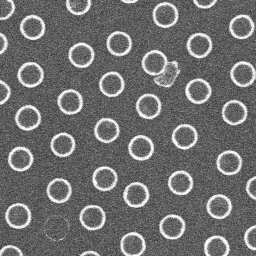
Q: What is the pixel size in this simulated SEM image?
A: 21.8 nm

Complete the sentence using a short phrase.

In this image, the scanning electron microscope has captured a regular array of raised bodies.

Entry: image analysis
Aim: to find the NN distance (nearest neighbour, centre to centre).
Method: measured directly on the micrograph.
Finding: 918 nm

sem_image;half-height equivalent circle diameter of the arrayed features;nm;498